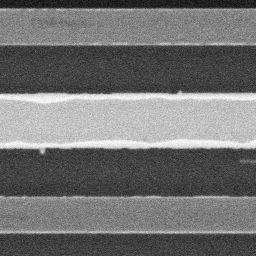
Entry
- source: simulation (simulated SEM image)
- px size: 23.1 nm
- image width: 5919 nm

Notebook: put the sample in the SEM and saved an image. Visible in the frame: lines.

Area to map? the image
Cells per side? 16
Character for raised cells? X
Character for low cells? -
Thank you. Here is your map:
----------------
XXXXXXXXXXXXXXXX
XXXXXXXXXXXXXXXX
----------------
----------------
----------------
XXXXXXXXXXXXXXXX
XXXXXXXXXXXXXXXX
XXXXXXXXXXXXXXXX
----------------
----------------
----------------
XXXXXXXXXXXXXXXX
XXXXXXXXXXXXXXXX
XXXX-XXXXXXXXXXX
----------------